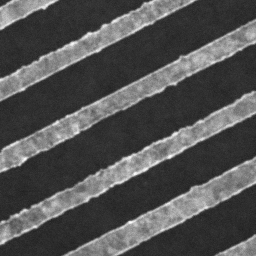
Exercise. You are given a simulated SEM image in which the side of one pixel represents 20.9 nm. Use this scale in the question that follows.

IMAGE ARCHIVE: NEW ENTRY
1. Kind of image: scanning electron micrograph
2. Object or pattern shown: one or a few lines or trenches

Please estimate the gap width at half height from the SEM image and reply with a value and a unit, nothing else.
964 nanometres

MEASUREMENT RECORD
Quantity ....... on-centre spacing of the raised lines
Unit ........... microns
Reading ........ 1.32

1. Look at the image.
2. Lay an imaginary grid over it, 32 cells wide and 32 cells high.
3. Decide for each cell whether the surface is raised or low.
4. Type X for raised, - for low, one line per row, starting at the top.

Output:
-XXXXX------------XXXXX---------
XXXX-------------XXXX-----------
XX------------XXXXXX------------
-------------XXXXX------------XX
-----------XXXXX------------XXXX
---------XXXXX------------XXXXX-
-------XXXXX------------XXXXX---
-----XXXXX------------XXXXX-----
---XXXXX------------XXXXX-------
-XXXXX-------------XXXX---------
XXXX-------------XXXX-----------
XX-------------XXXXX------------
-------------XXXX-------------XX
-----------XXXXX------------XXXX
---------XXXX-------------XXXXX-
-------XXXXX-------------XXXX---
-----XXXXX------------XXXXX-----
---XXXXX-------------XXXX-------
-XXXXX------------XXXXX---------
XXXX------------XXXXX-----------
XXX------------XXXX-----------XX
-------------XXXXX----------XXXX
-----------XXXXX-----------XXXXX
---------XXXX-----------XXXXXXX-
-------XXXXX-----------XXXXXX---
-----XXXXX-----------XXXXXX-----
---XXXXX-----------XXXXXX-------
-XXXXX-----------XXXXXX---------
XXXX-----------XXXXXX-----------
XX-----------XXXXXX-------------
-----------XXXXXX-------------XX
---------XXXXXX-------------XXXX